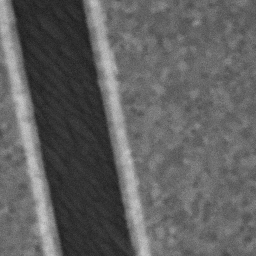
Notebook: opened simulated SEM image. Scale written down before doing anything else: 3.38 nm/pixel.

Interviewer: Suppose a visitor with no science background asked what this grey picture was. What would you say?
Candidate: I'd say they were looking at one or a few lines or trenches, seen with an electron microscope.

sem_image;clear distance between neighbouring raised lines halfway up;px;92.6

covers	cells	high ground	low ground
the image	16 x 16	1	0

0000001111111111
0000001111111111
0000001111111111
1000000111111111
1000000111111111
1000000111111111
1000000111111111
1000000111111111
1100000011111111
1100000011111111
1100000011111111
1100000011111111
1110000011111111
1110000001111111
1110000001111111
1110000001111111